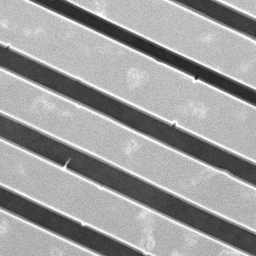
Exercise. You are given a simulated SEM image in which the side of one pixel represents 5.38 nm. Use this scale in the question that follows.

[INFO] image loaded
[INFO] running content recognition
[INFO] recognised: one or a few lines or trenches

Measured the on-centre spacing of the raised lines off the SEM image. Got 355 nm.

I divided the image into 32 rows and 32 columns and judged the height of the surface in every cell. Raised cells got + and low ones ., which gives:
+++++....+++++++++++++......++++
+++++++....+++++++++++++......++
+++++++++....+++++++++++++......
+++++++++++....++++++++++++++...
+++++++++++++....++++++++++++++.
+++++++++++++++....+++++++++++++
..++++++++++++++++....++++++++++
.....+++++++++++++++....++++++++
.......+++++++++++++++....++++++
++.......+++++++++++++++....++++
++++.......+++++++++++++++....++
+++++++......+++++++++++++++....
+++++++++......+++++++++++++++..
+++++++++++......+++++++++++++++
.++++++++++++......+++++++++++++
...++++++++++++.......++++++++++
.....++++++++++++......+++++++++
.......++++++++++++.......++++++
+++.......++++++++++++......++++
+++++.......++++++++++++......++
+++++++.......++++++++++++......
+++++++++.......++++++++++++....
+++++++++++.......++++++++++++..
.++++++++++++.......++++++++++++
...++++++++++++.......++++++++++
.....+++++++++++++......++++++++
+......+++++++++++++......++++++
+++......+++++++++++++.......+++
+++++......+++++++++++++.......+
+++++++.......++++++++++++......
++++++++++......++++++++++++....
++++++++++++......++++++++++++..